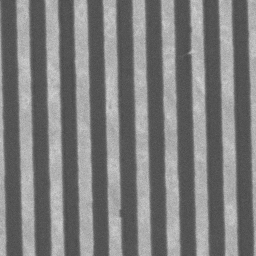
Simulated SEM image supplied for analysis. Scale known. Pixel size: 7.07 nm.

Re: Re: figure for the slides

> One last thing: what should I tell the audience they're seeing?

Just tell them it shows parallel lines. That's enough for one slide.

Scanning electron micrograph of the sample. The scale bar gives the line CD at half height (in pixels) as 14.5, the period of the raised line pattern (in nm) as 205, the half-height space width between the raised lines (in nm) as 102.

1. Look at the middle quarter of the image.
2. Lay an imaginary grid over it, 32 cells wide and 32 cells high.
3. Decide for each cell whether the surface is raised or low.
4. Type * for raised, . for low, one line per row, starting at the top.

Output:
...***....****...****....***....
...***....****...****....***....
...***....****...****....***....
...***....****...****....***....
...***....****...****....***....
...***....****...****....***....
...***....****....***....***....
...***....****....***....***....
...***....****....***....***....
...***....****....***....***....
...****...****....***....***....
...****...****....***....***....
...****...****....***....***....
...****...****....***....***....
...****...****....***....***....
...****...****....***....***....
...****....***....***....***....
...****....***....***....***....
...****....***....***....***....
...****....***....***....***....
...****....***....***....***....
...****....***....***....****...
...****....***....***....****...
...****....***....***....****...
...****....***....***....****...
...****....***....***....****...
....***....***....***....****...
...****....***....***....****...
...****....***....***....****...
...****....***....***....****...
...****....***....***....****...
....***....***....****...****...